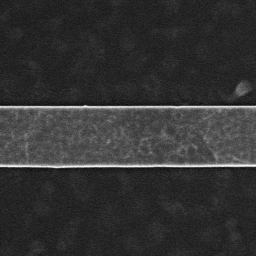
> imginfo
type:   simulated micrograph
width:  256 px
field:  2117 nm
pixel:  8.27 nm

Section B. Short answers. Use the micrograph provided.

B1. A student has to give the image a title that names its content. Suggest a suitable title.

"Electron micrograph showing one or a few lines or trenches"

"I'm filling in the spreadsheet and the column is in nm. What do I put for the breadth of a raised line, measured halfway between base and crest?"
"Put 500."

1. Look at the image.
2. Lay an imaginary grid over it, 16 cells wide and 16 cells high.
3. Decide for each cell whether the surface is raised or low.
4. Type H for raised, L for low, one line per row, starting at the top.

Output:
LLLLLLLLLLLLLLLL
LLLLLLLLLLLLLLLL
LLLLLLLLLLLLLLLL
LLLLLLLLLLLLLLLL
LLLLLLLLLLLLLLLL
LLLLLLLLLLLLLLLL
LLLLLLLLLLLLLLLL
HHHHHHHHHHHHHHHH
HHHHHHHHHHHHHHHH
HHHHHHHHHHHHHHHH
LLLLLLLLLLLLLLLL
LLLLLLLLLLLLLLLL
LLLLLLLLLLLLLLLL
LLLLLLLLLLLLLLLL
LLLLLLLLLLLLLLLL
LLLLLLLLLLLLLLLL